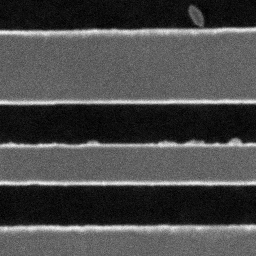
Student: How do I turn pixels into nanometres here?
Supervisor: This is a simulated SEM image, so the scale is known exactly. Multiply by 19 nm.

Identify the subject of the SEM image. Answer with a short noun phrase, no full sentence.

lines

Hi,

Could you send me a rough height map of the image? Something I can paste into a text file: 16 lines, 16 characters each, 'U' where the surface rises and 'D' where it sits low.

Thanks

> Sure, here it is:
DDDDDDDDDDDDDDDD
DDDDDDDDDDDDDDDD
UUUUUUUUUUUUUUUU
UUUUUUUUUUUUUUUU
UUUUUUUUUUUUUUUU
UUUUUUUUUUUUUUUU
DDDDDDDDDDDDDDDD
DDDDDDDDDDDDDDDD
DDDDDDDDDDDDDDDD
UUUUUUUUUUUUUUUU
UUUUUUUUUUUUUUUU
UUUUUUUUUUUUUUUU
DDDDDDDDDDDDDDDD
DDDDDDDDDDDDDDDD
UUUUUUUUUUUUUUUU
UUUUUUUUUUUUUUUU